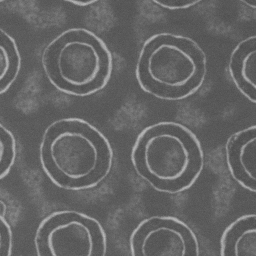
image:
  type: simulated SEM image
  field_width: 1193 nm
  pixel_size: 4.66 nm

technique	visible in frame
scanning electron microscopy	ring-shaped raised bodies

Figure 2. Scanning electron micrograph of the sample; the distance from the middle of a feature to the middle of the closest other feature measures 422 nanometres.